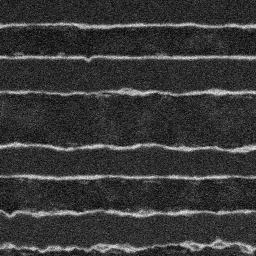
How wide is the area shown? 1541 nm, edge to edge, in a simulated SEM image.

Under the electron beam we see one or a few lines or trenches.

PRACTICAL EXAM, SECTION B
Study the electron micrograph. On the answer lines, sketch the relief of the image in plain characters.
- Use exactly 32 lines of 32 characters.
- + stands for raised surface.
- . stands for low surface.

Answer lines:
++++++++++++++++++++++++++++++++
++++++++++++++++++++++++++++++++
++++++++++++++++++++++++++++++++
................................
................................
................................
................................
++++++++++++++++++++++++++++++++
++++++++++++++++++++++++++++++++
++++++++++++++++++++++++++++++++
++++++++++++++++++++++++++++++++
+++++++++++++.++++++++++++++++++
................................
................................
................................
................................
................................
................................
+++++++..++++++++++++...+++....+
++++++++++++++++++++++++++++++++
++++++++++++++++++++++++++++++++
++++++++++++++++++++++++++++++++
................................
................................
................................
................................
+.++....+..++++.........++..++++
++++++++++++++++++++++++++++++++
++++++++++++++++++++++++++++++++
++++++++++++++++++++++++++++++++
+++++++++++++++++++++++++++.++++
................................